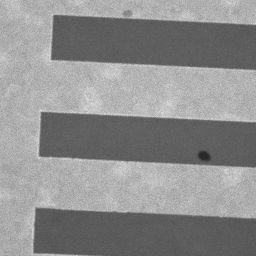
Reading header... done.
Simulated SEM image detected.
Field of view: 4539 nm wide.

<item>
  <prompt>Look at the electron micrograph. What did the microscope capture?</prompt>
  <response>one or a few lines or trenches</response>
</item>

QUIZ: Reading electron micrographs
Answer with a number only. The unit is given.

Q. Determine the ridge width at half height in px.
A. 50.2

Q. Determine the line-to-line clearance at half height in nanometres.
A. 826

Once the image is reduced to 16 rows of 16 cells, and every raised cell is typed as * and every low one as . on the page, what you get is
****************
***............*
***.............
***.............
****************
****************
****************
**............**
**..............
**..............
****************
****************
****************
**...........***
**..............
**..............